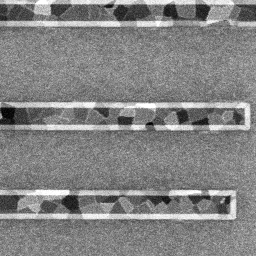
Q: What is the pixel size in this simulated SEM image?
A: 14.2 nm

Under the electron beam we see one or a few lines or trenches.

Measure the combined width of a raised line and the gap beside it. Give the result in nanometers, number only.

1370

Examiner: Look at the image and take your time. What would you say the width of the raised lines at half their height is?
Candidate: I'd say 0.306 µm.